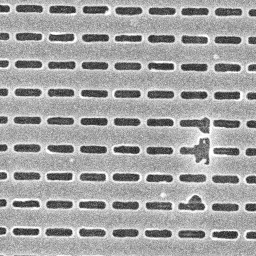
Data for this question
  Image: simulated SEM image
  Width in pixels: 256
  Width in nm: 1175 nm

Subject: a regular array of holes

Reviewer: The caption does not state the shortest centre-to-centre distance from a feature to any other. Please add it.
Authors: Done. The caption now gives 128 nanometers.